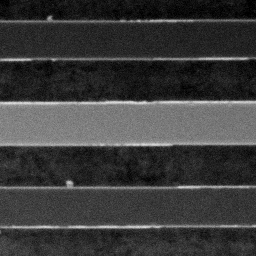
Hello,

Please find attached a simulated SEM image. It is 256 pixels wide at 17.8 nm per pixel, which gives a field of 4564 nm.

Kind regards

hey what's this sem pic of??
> lines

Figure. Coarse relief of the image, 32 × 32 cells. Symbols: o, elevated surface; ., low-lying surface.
................................
................................
................................
oooooooooooooooooooooooooooooooo
oooooooooooooooooooooooooooooooo
oooooooooooooooooooooooooooooooo
oooooooooooooooooooooooooooooooo
................................
................................
................................
................................
................................
................................
oooooooooooooooooooooooooooooooo
oooooooooooooooooooooooooooooooo
oooooooooooooooooooooooooooooooo
oooooooooooooooooooooooooooooooo
oooooooooooooooooooooooooooooooo
................................
................................
................................
................................
................................
oooooooooooooooooooooooooooooooo
oooooooooooooooooooooooooooooooo
oooooooooooooooooooooooooooooooo
oooooooooooooooooooooooooooooooo
oooooooooooooooooooooooooooooooo
................................
................................
................................
................................